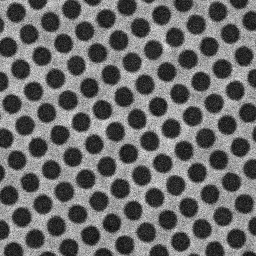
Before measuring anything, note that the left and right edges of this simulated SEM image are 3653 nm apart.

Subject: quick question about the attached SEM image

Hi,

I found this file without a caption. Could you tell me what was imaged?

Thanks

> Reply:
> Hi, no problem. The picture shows a regular array of holes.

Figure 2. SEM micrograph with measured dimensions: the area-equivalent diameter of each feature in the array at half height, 286 nm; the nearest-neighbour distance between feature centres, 352 nanometres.